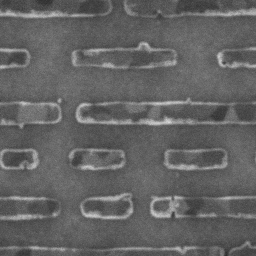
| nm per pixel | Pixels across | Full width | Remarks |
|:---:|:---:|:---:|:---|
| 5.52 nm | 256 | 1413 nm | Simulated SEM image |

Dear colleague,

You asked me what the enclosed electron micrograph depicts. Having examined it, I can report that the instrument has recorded parallel lines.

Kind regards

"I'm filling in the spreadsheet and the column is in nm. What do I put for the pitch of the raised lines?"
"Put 276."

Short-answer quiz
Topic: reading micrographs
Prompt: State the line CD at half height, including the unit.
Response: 104 nm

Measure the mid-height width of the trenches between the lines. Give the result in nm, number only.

177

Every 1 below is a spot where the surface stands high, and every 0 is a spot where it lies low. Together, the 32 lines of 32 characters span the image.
11111111111111001111111111111111
11111111111111001111111111111111
00000000000000000000000000000000
00000000000000000000000000000000
00000000000000000000000000000000
00000000000000000000000000000000
11100000011111111111110000001111
11110000011111111111110000001111
00000000000000000000000000000000
00000000000000000000000000000000
00000000000000000000000000000000
00000000000000000000000000000000
00000000000000000000000000000000
11111110001111111111111111111111
11111111001111111111111111111111
11100000000000000000000000000000
00000000000000000000000000000000
00000000000000000000000000000000
00000000000000000000000000000000
11111000011111110000011111110000
11111000011111100000011111110000
00000000000000000000000000000000
00000000000000000000000000000000
00000000000000000000000000000000
00000000000000010000000000000000
11111111001111110001111111111111
11111110001111110001111111111111
00000000000000000000000000000000
00000000000000000000000000000000
00000000000000000000000000000000
00000000000000000000000000000000
11111111111111111111111111110111